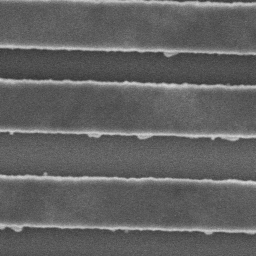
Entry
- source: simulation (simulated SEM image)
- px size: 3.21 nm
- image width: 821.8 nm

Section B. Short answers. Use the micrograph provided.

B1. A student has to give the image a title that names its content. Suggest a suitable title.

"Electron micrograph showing lines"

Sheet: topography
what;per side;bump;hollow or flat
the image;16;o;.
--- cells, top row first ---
oooooooooooooooo
oooooooooooooooo
oooooooooooooooo
................
................
oooooooooooooooo
oooooooooooooooo
oooooooooooooooo
...........ooooo
................
................
oooooooooooooooo
oooooooooooooooo
oooooooooooooooo
..............oo
................